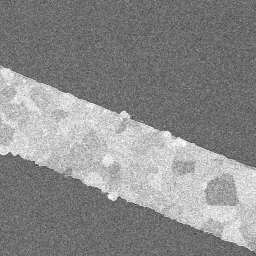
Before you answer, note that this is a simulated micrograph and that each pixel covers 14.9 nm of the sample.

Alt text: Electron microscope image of one or a few lines or trenches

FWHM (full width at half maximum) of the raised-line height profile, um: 1.13